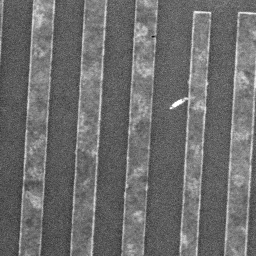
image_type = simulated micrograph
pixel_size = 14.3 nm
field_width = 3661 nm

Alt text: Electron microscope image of parallel lines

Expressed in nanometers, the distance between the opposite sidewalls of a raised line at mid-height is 296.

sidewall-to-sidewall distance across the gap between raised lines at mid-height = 436 nm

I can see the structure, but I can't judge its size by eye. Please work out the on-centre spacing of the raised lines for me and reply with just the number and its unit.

740 nm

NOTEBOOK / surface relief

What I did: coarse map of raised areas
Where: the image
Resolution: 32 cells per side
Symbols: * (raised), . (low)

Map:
....***....**....***............
....***....**....***............
....***...***....***....**....**
....***...***....**.....**....**
....***...***....**.....**....**
....***...***....**.....**....**
....**....***....**.....**....**
....**....***....**.....**....**
....**....***....**.....**...***
....**....***....**.....**...***
....**....***...***.....**...***
....**....***...***.....**...***
....**....***...***.....**...***
...***....**....***.....**...***
...***....**....***.....**...***
...***....**....***....**....***
...***....**....***....**....***
...***....**....***....**....**.
...***....**....***....**....**.
...***....**....***....**....**.
...***...***....**.....**....**.
...**.....**....**.....**....**.
...**....***....**.....**....**.
...**....***....**.....**....**.
...**....***....**.....**....**.
...**....***....**.....**....**.
...**....***....**.....**...***.
...**....***...***.....**...***.
...**....***...***.....**...***.
...**....***...***.....**...***.
..***....***...***.....**...***.
...**....**....***.....**...***.